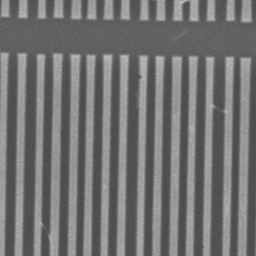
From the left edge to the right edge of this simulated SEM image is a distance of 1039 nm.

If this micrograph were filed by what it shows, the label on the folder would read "parallel lines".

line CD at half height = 33 nm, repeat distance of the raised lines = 0.0699 microns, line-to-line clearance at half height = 0.0366 µm